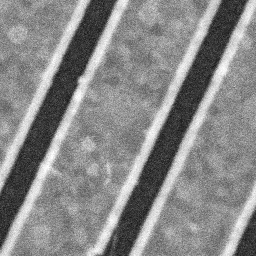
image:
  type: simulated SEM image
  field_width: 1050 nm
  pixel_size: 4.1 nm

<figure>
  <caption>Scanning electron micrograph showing one or a few lines or trenches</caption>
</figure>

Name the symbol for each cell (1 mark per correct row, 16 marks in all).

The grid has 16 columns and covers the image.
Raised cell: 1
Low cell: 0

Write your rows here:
1111100111111000
1111100111111001
1111001111110001
1111001111110011
1110001111100011
1110011111100111
1100011111000111
1100111111001111
1000111111001111
1001111110011111
0001111110011111
0011111100111111
0011111100111111
0111111000111110
0111111001111110
1111110001111100